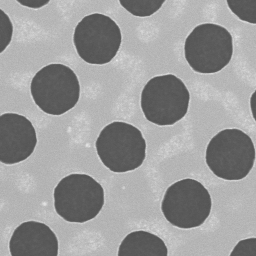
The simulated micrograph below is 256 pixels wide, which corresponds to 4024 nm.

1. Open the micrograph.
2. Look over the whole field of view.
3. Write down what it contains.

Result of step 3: holes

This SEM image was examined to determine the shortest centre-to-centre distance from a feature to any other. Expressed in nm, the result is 1030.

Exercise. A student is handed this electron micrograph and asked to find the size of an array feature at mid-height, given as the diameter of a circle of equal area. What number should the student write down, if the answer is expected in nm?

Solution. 783